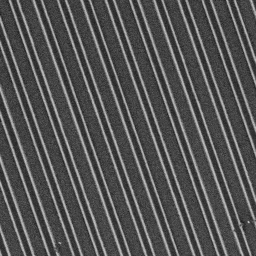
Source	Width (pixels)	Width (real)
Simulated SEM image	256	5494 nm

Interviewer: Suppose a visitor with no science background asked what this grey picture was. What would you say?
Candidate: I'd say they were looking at parallel lines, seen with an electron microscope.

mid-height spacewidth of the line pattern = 0.33 microns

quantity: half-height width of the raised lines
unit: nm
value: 165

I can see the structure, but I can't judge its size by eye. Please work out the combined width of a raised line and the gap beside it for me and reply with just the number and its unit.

0.49 microns